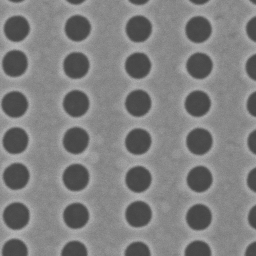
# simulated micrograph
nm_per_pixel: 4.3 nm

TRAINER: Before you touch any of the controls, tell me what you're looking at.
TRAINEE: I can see a regular array of holes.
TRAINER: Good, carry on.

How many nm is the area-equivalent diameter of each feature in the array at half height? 115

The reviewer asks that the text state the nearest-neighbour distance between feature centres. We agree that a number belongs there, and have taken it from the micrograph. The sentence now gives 160 nm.